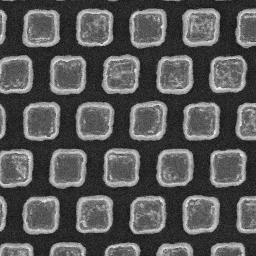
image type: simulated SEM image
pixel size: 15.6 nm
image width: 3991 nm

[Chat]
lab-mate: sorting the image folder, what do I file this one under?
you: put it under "a regular array of raised bodies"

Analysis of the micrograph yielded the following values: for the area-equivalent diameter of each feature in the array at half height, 573 nanometres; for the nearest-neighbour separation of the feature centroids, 828 nm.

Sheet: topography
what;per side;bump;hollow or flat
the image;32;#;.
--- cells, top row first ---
................................
....#......##.....##....###...##
#..####...####...####..####...##
#..####...####...####..####...##
...####...####...###...####...##
....###....##....##.....#.....##
................................
.###...###....###...####...###..
####..#####..####...####..#####.
####...###...####...####..#####.
####...###...####...####..####..
#......#.............##.........
................................
....###...####...####...###...##
#..####...####...####..####...##
#..####...####..#####..####...##
...####...####...###...####...##
................................
................................
####...###...####...####...###..
####...###...####...####..#####.
####...###...####...####...####.
####...###...####...####...###..
................................
................................
#..####...####...###...####...##
#..####...####..#####..####...##
#..####...####..#####..####...##
...####...####..####...####...##
................................
................................
####..####...####...####...###..